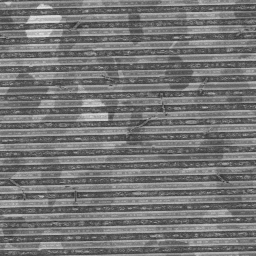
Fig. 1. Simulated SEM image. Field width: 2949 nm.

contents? parallel lines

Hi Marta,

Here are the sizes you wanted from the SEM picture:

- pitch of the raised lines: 163 nm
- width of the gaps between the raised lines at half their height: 0.101 um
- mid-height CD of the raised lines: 67.7 nm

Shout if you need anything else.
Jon